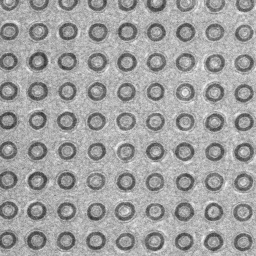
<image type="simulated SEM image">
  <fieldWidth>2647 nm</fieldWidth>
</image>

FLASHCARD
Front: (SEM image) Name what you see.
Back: a regular array of ring-shaped raised bodies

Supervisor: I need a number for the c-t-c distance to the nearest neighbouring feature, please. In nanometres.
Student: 300